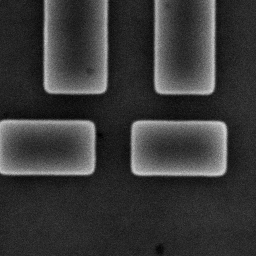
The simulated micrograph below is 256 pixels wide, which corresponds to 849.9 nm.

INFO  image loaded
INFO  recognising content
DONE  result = wiring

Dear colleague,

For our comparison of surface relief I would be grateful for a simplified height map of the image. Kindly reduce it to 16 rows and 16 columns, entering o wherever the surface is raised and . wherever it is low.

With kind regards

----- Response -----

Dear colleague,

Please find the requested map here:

...oooo...ooo...
...oooo...ooo...
...oooo...ooo...
...oooo...ooo...
...oooo...ooo...
...oooo...ooo...
................
................
oooooo..oooooo..
oooooo..oooooo..
oooooo..oooooo..
................
................
................
................
................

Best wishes